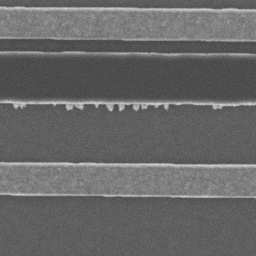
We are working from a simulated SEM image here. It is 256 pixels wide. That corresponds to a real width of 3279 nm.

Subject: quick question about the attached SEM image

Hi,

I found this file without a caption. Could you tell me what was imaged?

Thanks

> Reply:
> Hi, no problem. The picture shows lines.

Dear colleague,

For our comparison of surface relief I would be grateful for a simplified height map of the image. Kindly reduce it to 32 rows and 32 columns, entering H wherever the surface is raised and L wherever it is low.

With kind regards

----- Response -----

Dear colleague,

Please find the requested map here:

LLLLLLLLLLLLLLLLLLLLLLLLLLLLLLLL
HHHHHHHHHHHHHHHHHHHHHHHHHHHHHHHH
HHHHHHHHHHHHHHHHHHHHHHHHHHHHHHHH
HHHHHHHHHHHHHHHHHHHHHHHHHHHHHHHH
HHHHHHHHHHHHHHHHHHHHHHHHHHHHHHHH
LLLLLLLLLLLLLLLLLLLLLLLLLLLLLLLL
LLLLLLLLLLLLLLLLLLLLLLLLLLLLLLLL
HHHHHHHHHHHHHHHHHHHHHHHHHHHHHHHH
HHHHHHHHHHHHHHHHHHHHHHHHHHHHHHHH
HHHHHHHHHHHHHHHHHHHHHHHHHHHHHHHH
HHHHHHHHHHHHHHHHHHHHHHHHHHHHHHHH
HHHHHHHHHHHHHHHHHHHHHHHHHHHHHHHH
HHHHHHHHHHHHHHHHHHHHHHHHHHHHHHHH
LLLLLLLLLLLLLLLLLLLLLLLLLLLLLLLL
LLLLLLLLLLLLLLLLLLLLLLLLLLLLLLLL
LLLLLLLLLLLLLLLLLLLLLLLLLLLLLLLL
LLLLLLLLLLLLLLLLLLLLLLLLLLLLLLLL
LLLLLLLLLLLLLLLLLLLLLLLLLLLLLLLL
LLLLLLLLLLLLLLLLLLLLLLLLLLLLLLLL
LLLLLLLLLLLLLLLLLLLLLLLLLLLLLLLL
HHHHHLLLLLLLLLLLLLLLLLLLLLLLLLLL
HHHHHHHHHHHHHHHHHHHHHHHHHHHHHHHH
HHHHHHHHHHHHHHHHHHHHHHHHHHHHHHHH
HHHHHHHHHHHHHHHHHHHHHHHHHHHHHHHH
LLLLLLLLLLLLLLLLLLLLLLHHHHHHHHHH
LLLLLLLLLLLLLLLLLLLLLLLLLLLLLLLL
LLLLLLLLLLLLLLLLLLLLLLLLLLLLLLLL
LLLLLLLLLLLLLLLLLLLLLLLLLLLLLLLL
LLLLLLLLLLLLLLLLLLLLLLLLLLLLLLLL
LLLLLLLLLLLLLLLLLLLLLLLLLLLLLLLL
LLLLLLLLLLLLLLLLLLLLLLLLLLLLLLLL
LLLLLLLLLLLLLLLLLLLLLLLLLLLLLLLL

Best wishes